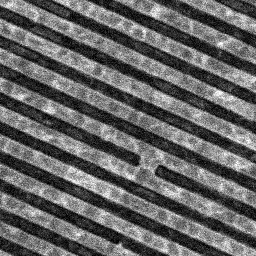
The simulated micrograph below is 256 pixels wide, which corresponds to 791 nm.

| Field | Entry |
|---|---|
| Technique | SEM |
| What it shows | parallel lines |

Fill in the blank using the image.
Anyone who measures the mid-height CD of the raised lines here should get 0.0418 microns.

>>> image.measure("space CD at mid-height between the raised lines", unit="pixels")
12.6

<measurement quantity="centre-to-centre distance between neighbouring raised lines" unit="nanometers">81.1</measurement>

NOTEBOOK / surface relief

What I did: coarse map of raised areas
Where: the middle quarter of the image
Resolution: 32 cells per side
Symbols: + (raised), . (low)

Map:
..++++++++........++++++++......
....++++++++........++++++++....
......++++++++........++++++++..
........++++++++........++++++++
++.........++++++++.......++++++
+++++........++++++++........+++
+++++++........++++++++........+
.++++++++........++++++++.......
...++++++++........++++++++.....
......+++++++.........++++++++..
........++++++++........++++++++
++........++++++++........++++++
++++........++++++++........++++
++++++........++++++++........++
.++++++++........+++++++........
...++++++++........+++++++......
.....++++++++........++++++++...
.......++++++++........++++++++.
++.......++++++++........+++++++
++++........++++++++........++++
++++++........++++++++........++
++++++++........++++++++........
..++++++++........++++++++......
.....++++++++......+++++++++....
.......++++++++....++++++++++++.
+........++++++++..++++..+++++++
+++........++++++++++++....+++++
++++++.......++++++++++......+++
++++++++........++++++++.......+
..++++++++........++++++++......
....++++++++........++++++++....
......++++++++........++++++++..